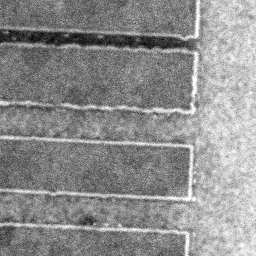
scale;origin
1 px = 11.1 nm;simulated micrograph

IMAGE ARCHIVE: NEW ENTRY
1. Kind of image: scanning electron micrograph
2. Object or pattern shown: one or a few lines or trenches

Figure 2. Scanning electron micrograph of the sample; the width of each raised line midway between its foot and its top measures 0.627 um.